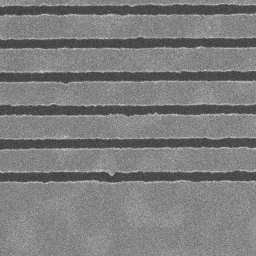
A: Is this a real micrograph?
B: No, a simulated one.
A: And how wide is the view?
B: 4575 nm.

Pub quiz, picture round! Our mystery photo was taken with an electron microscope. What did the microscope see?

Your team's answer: parallel lines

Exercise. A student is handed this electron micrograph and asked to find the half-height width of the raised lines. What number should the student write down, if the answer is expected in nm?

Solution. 413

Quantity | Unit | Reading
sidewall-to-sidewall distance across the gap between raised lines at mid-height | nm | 183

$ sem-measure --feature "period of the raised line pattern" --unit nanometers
596